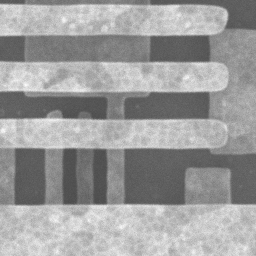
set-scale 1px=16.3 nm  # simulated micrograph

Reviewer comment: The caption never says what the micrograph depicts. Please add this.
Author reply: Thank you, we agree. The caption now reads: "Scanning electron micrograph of wiring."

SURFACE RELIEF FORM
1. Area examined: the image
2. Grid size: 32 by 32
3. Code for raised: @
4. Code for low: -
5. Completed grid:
--------------------------------
@@@@@@@@@@@@@@@@@@@@@@@@@@@@----
@@@@@@@@@@@@@@@@@@@@@@@@@@@@----
@@@@@@@@@@@@@@@@@@@@@@@@@@@@----
--------------------------------
--------------------------------
--------------------------------
--------------------------------
@@@@@@@@@@@@@@@@@@@@@@@@@@@@----
@@@@@@@@@@@@@@@@@@@@@@@@@@@@----
@@@@@@@@@@@@@@@@@@@@@@@@@@@@----
--------------------------------
--------------------------------
--------------------------------
--------------------------------
@@@@@@@@@@@@@@@@@@@@@@@@@@@@----
@@@@@@@@@@@@@@@@@@@@@@@@@@@@----
@@@@@@@@@@@@@@@@@@@@@@@@@@@@----
-----------@@@@@----@@@@--------
--------------------------------
--------------------------------
--------------------------------
--------------------------------
--------------------------------
--------------------------------
--------------------------------
@@@@@@@@@@@@@@@@@@@@@@@@@@@@@@@@
@@@@@@@@@@@@@@@@@@@@@@@@@@@@@@@@
@@@@@@@@@@@@@@@@@@@@@@@@@@@@@@@@
@@@@@@@@@@@@@@@@@@@@@@@@@@@@@@@@
@@@@@@@@@@@@@@@@@@@@@@@@@@@@@@@@
@@@@@@@@@@@@@@@@@@@@@@@@@@@@@@@@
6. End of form